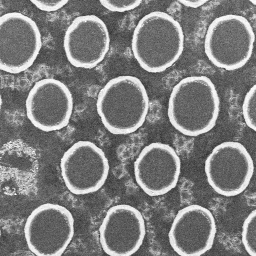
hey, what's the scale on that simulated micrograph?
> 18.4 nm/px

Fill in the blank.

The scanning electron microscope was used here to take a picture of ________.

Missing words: a regular array of raised bodies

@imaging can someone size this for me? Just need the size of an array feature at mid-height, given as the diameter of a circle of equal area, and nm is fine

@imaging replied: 858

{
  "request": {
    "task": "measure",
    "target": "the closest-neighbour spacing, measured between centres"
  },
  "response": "1.32 microns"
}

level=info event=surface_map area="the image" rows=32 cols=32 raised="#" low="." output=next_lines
.....###.....####.......#.......
................................
####......##......####.....###..
####.....####....#####....#####.
#####...#####....######...######
#####...#####....######...######
#####...#####....#####....#####.
####.....###.....#####.....####.
###...............##............
................................
.....##.......####....####......
....####.....#####....#####....#
....#####....#####...######....#
....#####...######...######....#
....#####....#####...######....#
.....###.....####.....####.....#
.......................##.......
................................
.........###.......##......###..
........#####.....####....#####.
........#####....#####....#####.
........#####....#####....#####.
........#####....#####....#####.
.........###......###......###..
................................
................................
....####......###......###......
....#####....#####....#####....#
...######....#####....#####....#
...######....#####...#####.....#
....####.....####.....####.....#
....####......##.......##......#